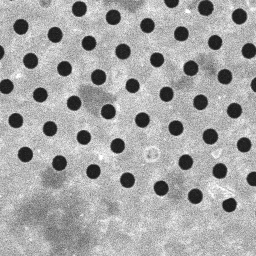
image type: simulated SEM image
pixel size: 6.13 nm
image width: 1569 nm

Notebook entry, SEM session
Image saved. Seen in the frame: a regular array of holes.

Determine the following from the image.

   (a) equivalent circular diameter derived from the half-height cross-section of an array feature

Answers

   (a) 90 nanometers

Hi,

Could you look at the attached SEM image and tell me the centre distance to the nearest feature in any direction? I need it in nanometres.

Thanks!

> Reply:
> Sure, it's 214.